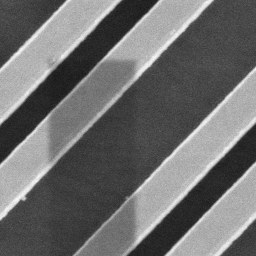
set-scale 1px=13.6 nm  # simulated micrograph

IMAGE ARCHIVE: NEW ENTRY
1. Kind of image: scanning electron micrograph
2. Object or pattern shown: lines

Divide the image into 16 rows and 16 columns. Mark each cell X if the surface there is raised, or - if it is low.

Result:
----XXX--XXXX---
---XXX---XXX----
--XXX---XXX-----
-XXX---XXX------
XXX---XXX-------
XX---XXX-------X
X---XXX-------XX
---XXX-------XXX
--XXX-------XXX-
-XXX-------XXX--
XXX-------XXX---
XX-------XXX---X
X-------XXX---XX
-------XXX---XXX
------XXX---XXX-
-----XXX---XXX--